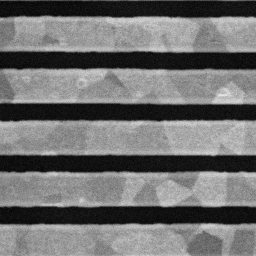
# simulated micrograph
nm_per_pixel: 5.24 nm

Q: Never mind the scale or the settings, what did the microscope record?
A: lines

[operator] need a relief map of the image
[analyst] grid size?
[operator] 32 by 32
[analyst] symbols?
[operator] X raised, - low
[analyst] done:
--------------------------------
--------------------------------
XXXXXXXXXXXXXXXXXXXXXXXXXXXXXXXX
XXXXXXXXXXXXXXXXXXXXXXXXXXXXXXXX
XXXXXXXXXXXXXXXXXXXXXXXXXXXXXXXX
XXXXXXXXXXXXXXXXXXXXXXXXXXXXXXXX
--------------------------------
--------------------------------
--------------------------------
XXXXXXXXXXXXXXXXXXXXXXXXXXXXXXXX
XXXXXXXXXXXXXXXXXXXXXXXXXXXXXXXX
XXXXXXXXXXXXXXXXXXXXXXXXXXXXXXXX
XXXXXXXXXXXXXXXXXXXXXXXXXXXXXXXX
--------------------------------
--------------------------------
XXXXXXXXXXXXXXXXXXXXXXXXXXXXXXXX
XXXXXXXXXXXXXXXXXXXXXXXXXXXXXXXX
XXXXXXXXXXXXXXXXXXXXXXXXXXXXXXXX
XXXXXXXXXXXXXXXXXXXXXXXXXXXXXXXX
--------------------------------
--------------------------------
--------------------------------
XXXXXXXXXXXXXXXXXXXXXXXXXXXXXXXX
XXXXXXXXXXXXXXXXXXXXXXXXXXXXXXXX
XXXXXXXXXXXXXXXXXXXXXXXXXXXXXXXX
XXXXXXXXXXXXXXXXXXXXXXXXXXXXXXXX
--------------------------------
--------------------------------
XXXXXXXXXXXXXXXXXXXXXXXXXXXXXXXX
XXXXXXXXXXXXXXXXXXXXXXXXXXXXXXXX
XXXXXXXXXXXXXXXXXXXXXXXXXXXXXXXX
XXXXXXXXXXXXXXXXXXXXXXXXXXXXXXXX